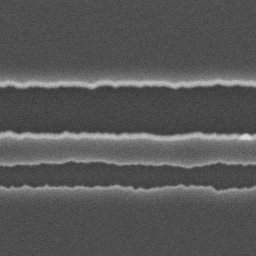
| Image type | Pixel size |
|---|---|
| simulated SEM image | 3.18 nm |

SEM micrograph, lines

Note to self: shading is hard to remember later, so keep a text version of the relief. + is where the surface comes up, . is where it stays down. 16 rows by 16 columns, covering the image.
++++++++++++++++
++++++++++++++++
++++++++++++++++
++++++++++++++++
++++++++++++++++
................
................
................
+++++++.+...+..+
++++++++++++++++
++++++++++++++++
++++++++++++++++
++++++++++++++++
++++++++++++++++
++++++++++++++++
++++++++++++++++